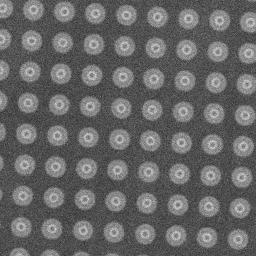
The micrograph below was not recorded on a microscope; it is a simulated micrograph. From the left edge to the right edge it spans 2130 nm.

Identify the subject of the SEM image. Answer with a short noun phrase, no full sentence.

an array of small figures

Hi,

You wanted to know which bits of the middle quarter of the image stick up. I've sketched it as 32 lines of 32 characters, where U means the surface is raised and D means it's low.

UDDDDDUUDDDDDDDDDDDDDDDDDDDDDDDD
UUDDDUUUUDDDDUUUUDDDDUUUDDDDDDDD
UUDDUUUUUDDDUUUUUDDDUUUUUDDDUUUU
UUDDDUUUUDDDUUUUUDDDUUUUUDDDUUUU
UDDDDUUUUDDDUUUUUDDDUUUUUDDDUUUU
DDDDDDDDDDDDDDUUDDDDDUUUDDDDUUUU
DDDDDDDDDDDDDDDDDDDDDDDDDDDDDUUD
DDDDDDDDDDDDDDDDDDDDDDDDDDDDDDDD
UDDDDUUUDDDDDDDDDDDDDDDDDDDDDDDD
UDDDUUUUUDDDUUUUDDDDDUUUDDDDDDDD
UDDDUUUUUDDDUUUUUDDDUUUUDDDDUUUU
UDDDUUUUUDDDUUUUUDDDUUUUDDDUUUUU
DDDDDUUUDDDDUUUUDDDDUUUUDDDUUUUU
DDDDDDDDDDDDDUUDDDDDUUUUDDDDUUUU
DDDDDDDDDDDDDDDDDDDDDDDDDDDDDDDD
DDDDDDDDDDDDDDDDDDDDDDDDDDDDDDDD
DDDDUUUUDDDDDUUDDDDDDDDDDDDDDDDD
UDDDUUUUDDDDUUUUDDDDUUUDDDDDUUDD
UDDDUUUUDDDUUUUUDDDUUUUUDDDUUUUU
DDDDUUUUDDDUUUUUDDDUUUUUDDDUUUUU
DDDDDUUDDDDDUUUUDDDUUUUUDDDUUUUU
DDDDDDDDDDDDDDDDDDDDDUUDDDDDUUUD
DDDDDDDDDDDDDDDDDDDDDDDDDDDDDDDD
DDDDDDDDDDDDDDDDDDDDDDDDDDDDDDDD
DDDDUUUUDDDDUUUDDDDDDDDDDDDDDDDD
DDDUUUUUDDDUUUUUDDDUUUUDDDDUUUUD
DDDUUUUUDDDUUUUUDDDUUUUUDDDUUUUD
DDDDUUUUDDDUUUUUDDDUUUUUDDUUUUUD
DDDDDUUDDDDDUUUDDDDUUUUDDDDUUUUD
DDDDDDDDDDDDDDDDDDDDDDDDDDDUUUDD
DDDDDDDDDDDDDDDDDDDDDDDDDDDDDDDD
DDDDUUDDDDDDDDDDDDDDDDDDDDDDDDDD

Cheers